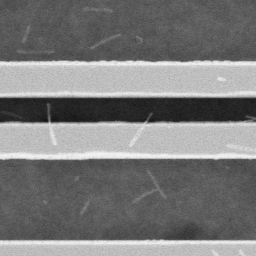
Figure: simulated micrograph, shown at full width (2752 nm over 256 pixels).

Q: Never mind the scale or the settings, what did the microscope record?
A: lines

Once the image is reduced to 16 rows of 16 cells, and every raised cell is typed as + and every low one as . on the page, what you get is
................
................
................
................
++++++++++++++++
++++++++++++++++
................
................
++++++++++++++++
++++++++++++++++
................
................
................
................
................
++++++++++++++++